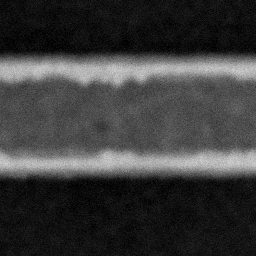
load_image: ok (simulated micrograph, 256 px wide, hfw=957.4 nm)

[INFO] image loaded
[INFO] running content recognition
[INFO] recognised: one or a few lines or trenches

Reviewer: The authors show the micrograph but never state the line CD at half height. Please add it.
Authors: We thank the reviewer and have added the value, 356 nanometres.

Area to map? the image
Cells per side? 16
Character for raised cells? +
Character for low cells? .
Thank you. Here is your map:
................
................
................
................
++++++++++++++++
++++++++++++++++
++++++++++++++++
++++++++++++++++
++++++++++++++++
++++++++++++++++
................
................
................
................
................
................